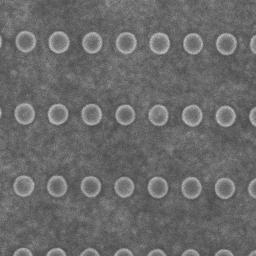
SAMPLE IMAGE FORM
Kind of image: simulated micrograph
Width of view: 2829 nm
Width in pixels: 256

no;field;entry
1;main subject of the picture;a regular array of raised bodies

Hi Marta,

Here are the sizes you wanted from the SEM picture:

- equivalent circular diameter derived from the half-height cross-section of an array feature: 0.223 um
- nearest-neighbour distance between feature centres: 368 nm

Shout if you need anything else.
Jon